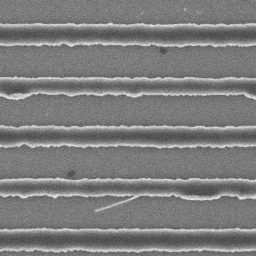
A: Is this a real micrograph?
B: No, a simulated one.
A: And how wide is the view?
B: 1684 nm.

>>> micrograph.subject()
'lines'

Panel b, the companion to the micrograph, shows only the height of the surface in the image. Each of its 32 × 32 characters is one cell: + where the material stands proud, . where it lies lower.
................................
................................
................................
++++++++++++++++++++++++++++++++
++++++++++++++++++++++++++++++++
++++++++++++.+++++++++++++++++++
................................
................................
................................
................................
++++++++++++++++++++++++++++++++
++++++++++++++++++++++++++++++++
................................
................................
................................
................................
++++++++++++++++++++++++++++++++
++++++++++++++++++++++++++++++++
................................
................................
................................
................................
+++++++++.++++++++++++++++++++++
++++++++++++++++++++++++++++++++
+.....+...+.....++....++++++.+++
................................
................................
................................
................................
++++++++++++++++++++++++++++++++
++++++++++++++++++++++++++++++++
................................